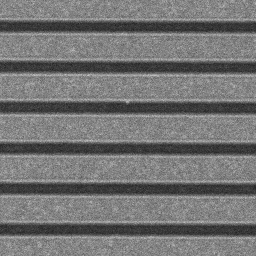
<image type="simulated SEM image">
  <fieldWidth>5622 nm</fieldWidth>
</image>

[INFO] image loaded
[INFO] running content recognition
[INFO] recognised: parallel lines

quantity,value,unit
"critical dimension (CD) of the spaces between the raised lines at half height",0.275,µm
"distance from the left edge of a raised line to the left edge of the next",891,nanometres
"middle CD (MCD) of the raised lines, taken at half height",615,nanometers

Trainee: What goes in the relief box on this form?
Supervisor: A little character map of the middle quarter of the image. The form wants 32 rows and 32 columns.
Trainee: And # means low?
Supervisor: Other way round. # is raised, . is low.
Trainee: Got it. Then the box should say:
................................
................................
########################........
################################
################################
################################
################################
################################
################################
................................
................................
................................
................................
################################
################################
################################
################################
################################
################################
################################
................................
................................
................................
################################
################################
################################
################################
################################
################################
......#....#####################
................................
................................